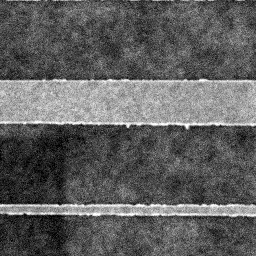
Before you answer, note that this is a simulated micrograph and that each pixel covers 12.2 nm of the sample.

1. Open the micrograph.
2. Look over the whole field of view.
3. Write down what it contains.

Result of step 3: lines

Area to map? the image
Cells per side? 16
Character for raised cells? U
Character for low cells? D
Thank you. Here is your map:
DDDDDDDDDDDDDDDD
DDDDDDDDDDDDDDDD
DDDDDDDDDDDDDDDD
DDDDDDDDDDDDDDDD
DDDDDDDDDDDDDDDD
UUUUUUUUUUUUUUUU
UUUUUUUUUUUUUUUU
UUUUUUUUUUUUUUUU
DDDDDDDDDDDDDDDD
DDDDDDDDDDDDDDDD
DDDDDDDDDDDDDDDD
DDDDDDDDDDDDDDDD
DDDDDDDDDDDDDDDD
DDDDDDDDDDDDDDDD
DDDDDDDDDDDDDDDD
DDDDDDDDDDDDDDDD